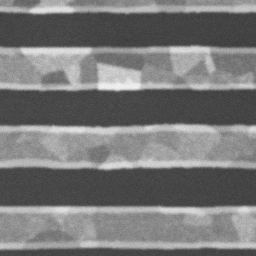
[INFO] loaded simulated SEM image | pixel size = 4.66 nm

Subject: lines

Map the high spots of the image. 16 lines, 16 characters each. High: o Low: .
oooooooooooooooo
................
................
oooooooooooooooo
oooooooooooooooo
................
................
................
oooooooooooooooo
oooooooooooooooo
................
................
................
oooooooooooooooo
oooooooooooooooo
................